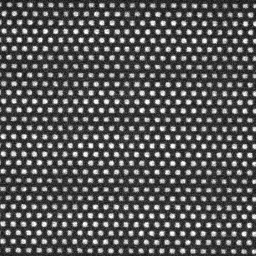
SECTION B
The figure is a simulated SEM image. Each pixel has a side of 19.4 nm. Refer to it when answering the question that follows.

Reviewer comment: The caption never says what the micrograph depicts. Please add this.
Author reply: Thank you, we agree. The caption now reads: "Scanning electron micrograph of a regular array of raised bodies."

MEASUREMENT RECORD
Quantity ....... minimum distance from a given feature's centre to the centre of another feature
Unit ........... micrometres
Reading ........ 0.191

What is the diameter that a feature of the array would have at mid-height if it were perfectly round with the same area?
81.9 nanometers